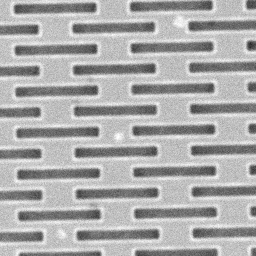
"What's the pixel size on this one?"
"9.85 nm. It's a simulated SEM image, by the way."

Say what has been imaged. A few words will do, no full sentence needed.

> groups of lines, slits or small figures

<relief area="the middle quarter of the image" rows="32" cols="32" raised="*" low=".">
**.....................********.
**.....................********.
**.....................*********
********************************
********************************
.........********...............
.........********...............
.........********...............
********************************
********************************
***....................********.
**.....................********.
**.....................********.
***...**************************
********************************
.........********...............
.........********...............
.........********...............
.....***************************
********************************
********...............*********
**......................*******.
**......................*******.
***............*****************
********************************
*******************.............
.........********...............
.........********...............
.........*********........******
********************************
********************************
***.....................********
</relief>